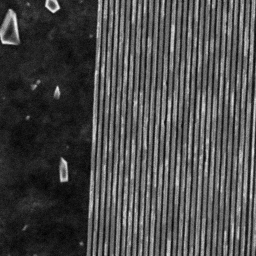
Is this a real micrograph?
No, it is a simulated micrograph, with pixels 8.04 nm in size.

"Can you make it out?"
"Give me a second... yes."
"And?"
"parallel lines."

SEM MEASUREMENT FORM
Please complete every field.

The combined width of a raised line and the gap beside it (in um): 0.0456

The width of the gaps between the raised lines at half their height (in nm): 19.1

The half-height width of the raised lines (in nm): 24.1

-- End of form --